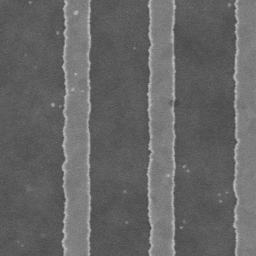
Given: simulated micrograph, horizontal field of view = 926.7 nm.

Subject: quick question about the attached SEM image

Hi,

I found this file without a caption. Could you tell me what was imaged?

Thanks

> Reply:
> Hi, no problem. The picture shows lines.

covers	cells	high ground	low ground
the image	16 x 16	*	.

....**...**....*
....**...**....*
....**...**....*
....**...**....*
....**...**....*
....**...**....*
....**...**....*
....**...**....*
....**...**....*
....**...**....*
....**...**....*
....**...**....*
....**...**....*
....**...**....*
....**...**....*
....**...**....*